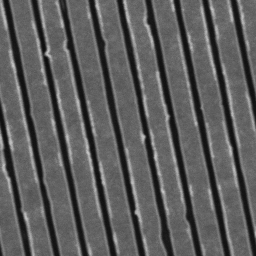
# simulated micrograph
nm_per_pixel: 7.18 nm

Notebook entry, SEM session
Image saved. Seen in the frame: parallel lines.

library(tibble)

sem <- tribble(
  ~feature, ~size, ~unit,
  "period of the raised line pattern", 200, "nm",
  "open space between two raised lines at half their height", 7.48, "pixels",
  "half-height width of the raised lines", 149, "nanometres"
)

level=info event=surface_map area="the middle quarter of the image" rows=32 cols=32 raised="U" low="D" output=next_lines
UUDDUUUUUDDUUUUUDDUUUUUDDUUUUUDD
UUDDUUUUUDDUUUUUDDDUUUUDDUUUUUUD
UUDDUUUUUDDDUUUUUDDUUUUUDDUUUUUD
UUDDDUUUUUDDUUUUUDDUUUUUDDUUUUUD
UUUDDUUUUUDDUUUUUDDUUUUUDDUUUUUD
UUUDDUUUUUDDUUUUUDDUUUUUDDUUUUUD
UUUDDUUUUUDDUUUUUDDDUUUUDDUUUUUU
UUUDDUUUUUDDDUUUUUDDUUUUUDDUUUUU
UUUDDDUUUUDDDUUUUUDDUUUUUDDUUUUU
UUUUDDUUUUUDDUUUUUDDUUUUUDDUUUUU
UUUUDDUUUUUDDUUUUUDDUUUUUDDUUUUU
UUUUDDUUUUUDDUUUUUDDUUUUUUDUUUUU
UUUUDDUUUUUDDUUUUUUDUUUUUUDDUUUU
UUUUDDDUUUUDDUUUUUUDDUUUUUDDUUUU
UUUUUDDUUUUUDDUUUUUDDUUUUUDDUUUU
UUUUUDDUUUUUDDUUUUUDDUUUUUDDUUUU
UUUUUDDUUUUUDDUUUUUDDUUUUUDDDUUU
UUUUUDDUUUUUDDUUUUUUDDUUUUUDDUUU
DUUUUUDDUUUUUDDUUUUUDDUUUUUDDUUU
DUUUUUDDUUUUUDDUUUUUDDUUUUUDDUUU
DUUUUUDDUUUUUDDUUUUUDDUUUUUDDUUU
DUUUUUDDUUUUUDDUUUUUDDUUUUUDDUUU
DUUUUUUDUUUUUDDUUUUUUDDUUUUUDDUU
DUUUUUUDUUUUUUDDUUUUUDDUUUUUDDUU
DUUUUUUDDUUUUUDDUUUUUDDUUUUUDDUU
DDUUUUUDDUUUUUDDUUUUUDDUUUUUDDUU
DDUUUUUDDUUUUUDDUUUUUDDUUUUUDDUU
DDUUUUUUDUUUUUDDUUUUUUDUUUUUUDDU
UDDUUUUUDUUUUUUDDUUUUUDDUUUUUDDU
UDDUUUUUDDUUUUUDDUUUUUDDUUUUUDDU
UDDUUUUUDDUUUUUDDUUUUUDDUUUUUDDU
UDDUUUUUDDUUUUUDDUUUUUDDUUUUUUDU